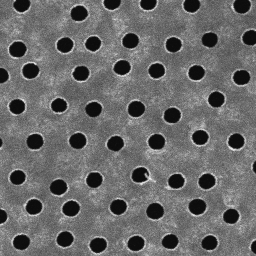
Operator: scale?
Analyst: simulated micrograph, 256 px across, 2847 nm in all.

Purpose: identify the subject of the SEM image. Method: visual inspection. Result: a regular array of holes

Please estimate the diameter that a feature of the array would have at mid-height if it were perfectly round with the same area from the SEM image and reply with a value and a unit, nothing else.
184 nm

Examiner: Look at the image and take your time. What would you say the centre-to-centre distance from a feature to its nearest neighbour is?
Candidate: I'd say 371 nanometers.